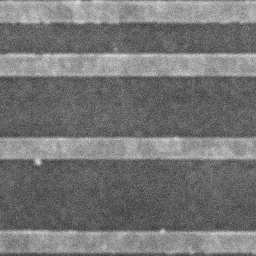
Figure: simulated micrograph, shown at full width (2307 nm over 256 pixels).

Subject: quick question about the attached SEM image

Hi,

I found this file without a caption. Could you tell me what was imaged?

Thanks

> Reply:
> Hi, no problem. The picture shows lines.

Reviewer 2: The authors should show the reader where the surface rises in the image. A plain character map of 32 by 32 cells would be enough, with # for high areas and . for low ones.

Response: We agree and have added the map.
################################
################################
################################
................................
................................
................................
................................
################################
################################
................................
................................
................................
................................
................................
................................
................................
................................
################################
################################
################################
................................
................................
................................
................................
................................
................................
................................
................................
................................
################################
################################
################################